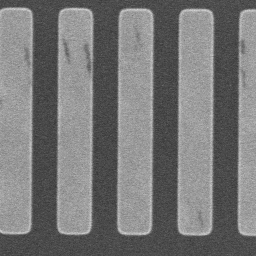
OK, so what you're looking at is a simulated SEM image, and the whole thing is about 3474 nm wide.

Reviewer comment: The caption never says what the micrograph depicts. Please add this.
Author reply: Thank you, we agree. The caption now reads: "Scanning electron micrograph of groups of lines, slits or small figures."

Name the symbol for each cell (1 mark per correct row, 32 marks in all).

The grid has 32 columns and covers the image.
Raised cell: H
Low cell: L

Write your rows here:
LLLLLLLLLLLLLLLLLLLLLLLLLLLLLLLL
HHHHLLLLHHHLLLLHHHHLLLLHHHLLLLHH
HHHHLLLHHHHHLLLHHHHLLLHHHHHLLLHH
HHHHLLLHHHHHLLLHHHHLLLHHHHHLLLHH
HHHHLLLHHHHHLLLHHHHLLLHHHHHLLLHH
HHHHLLLHHHHLLLLHHHHLLLHHHHHLLLHH
HHHHLLLHHHHLLLLHHHHLLLHHHHHLLLHH
HHHHLLLHHHHLLLLHHHHLLLHHHHHLLLHH
HHHHLLLHHHHLLLLHHHHLLLHHHHHLLLHH
HHHHLLLHHHHLLLLHHHHLLLHHHHHLLLHH
HHHHLLLHHHHLLLLHHHHLLLHHHHHLLLHH
HHHHLLLHHHHLLLLHHHHLLLHHHHHLLLHH
HHHHLLLHHHHLLLLHHHHLLLHHHHHLLLHH
HHHHLLLHHHHLLLLHHHHLLLHHHHHLLLHH
HHHHLLLHHHHLLLLHHHHLLLHHHHHLLLHH
HHHHLLLHHHHLLLLHHHHLLLHHHHHLLLHH
HHHHLLLHHHHLLLLHHHHLLLHHHHHLLLHH
HHHHLLLHHHHLLLLHHHHLLLHHHHHLLLHH
HHHHLLLHHHHLLLLHHHHLLLHHHHHLLLHH
HHHHLLLHHHHLLLLHHHHLLLHHHHHLLLHH
HHHHLLLHHHHLLLLHHHHLLLHHHHLLLLHH
HHHHLLLHHHHLLLLHHHHLLLHHHHLLLLHH
HHHHLLLHHHHLLLLHHHHLLLHHHHLLLLHH
HHHHLLLHHHHLLLLHHHHLLLHHHHLLLLHH
HHHHLLLHHHHLLLLHHHHLLLHHHHLLLLHH
HHHHLLLHHHHLLLLHHHHLLLHHHHLLLLHH
HHHHLLLHHHHLLLLHHHHLLLHHHHLLLLHH
HHHHLLLHHHHLLLLHHHHLLLHHHHLLLLHH
HHHHLLLHHHHLLLLHHHHLLLHHHHLLLLHH
LLLLLLLLLLLLLLLLLLLLLLLLLLLLLLLL
LLLLLLLLLLLLLLLLLLLLLLLLLLLLLLLL
LLLLLLLLLLLLLLLLLLLLLLLLLLLLLLLL